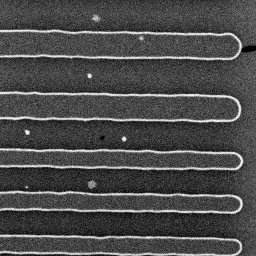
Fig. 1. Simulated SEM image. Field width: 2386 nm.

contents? groups of lines, slits or small figures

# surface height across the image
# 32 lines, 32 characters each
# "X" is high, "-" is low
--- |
--------------------------------
--------------------------------
--------------------------------
--------------------------------
XXXXXXXXXXXXXXXXXXXXXXXXXXXXX---
XXXXXXXXXXXXXXXXXXXXXXXXXXXXXX--
XXXXXXXXXXXXXXXXXXXXXXXXXXXXXX--
--------------------------------
--------------------------------
--------------------------------
--------------------------------
--------------------------------
XXXXXXXXXXXXXXXXXXXXXXXXXXXXX---
XXXXXXXXXXXXXXXXXXXXXXXXXXXXXX--
XXXXXXXXXXXXXXXXXXXXXXXXXXXXXX--
--------------------------------
--------------------------------
--------------------------------
--------------------------------
XXXXXXXXXXXXXXXXXXXXXXXXXXXXXX--
XXXXXXXXXXXXXXXXXXXXXXXXXXXXXX--
--------------------------------
--------------------------------
--------------------------------
XXXXXXXXXXXXXXXXXXXXXXXXXXXXX---
XXXXXXXXXXXXXXXXXXXXXXXXXXXXXX--
---------------------------XX---
--------------------------------
--------------------------------
XXXX----------------------------
XXXXXXXXXXXXXXXXXXXXXXXXXXXXXX--
-XXXXXXXXXXXXXXXXXXXXXXXXXXXXX--